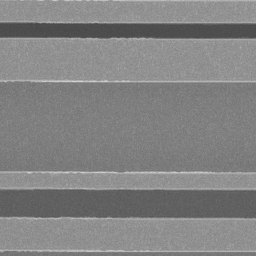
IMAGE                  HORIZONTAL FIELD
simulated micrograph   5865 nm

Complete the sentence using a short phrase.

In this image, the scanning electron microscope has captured lines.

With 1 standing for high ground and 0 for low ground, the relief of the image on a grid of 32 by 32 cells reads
11111111111111111111111111111111
11111111111111111111111111111111
11111111111111111111111111111111
00000000000000000000000000000000
00000000000000000000000000000000
11111111111111111111111111111111
11111111111111111111111111111111
11111111111111111111111111111111
11111111111111111111111111111111
11111111111111111111111111111111
00000000000000000000000000000000
00000000000000000000000000000000
00000000000000000000000000000000
00000000000000000000000000000000
00000000000000000000000000000000
00000000000000000000000000000000
00000000000000000000000000000000
00000000000000000000000000000000
00000000000000000000000000000000
00000000000000000000000000000000
00000000000000000000000000000000
00000000000000000000000000000000
11111111111111111111111111111111
00010001111111111111111111111111
00000000000000000000000000000000
00000000000000000000000000000000
00000000000000000000000000000000
11111111111111111111111111111111
11111111111111111111111111111111
11111111111111111111111111111111
11111111111111111111111111111111
00000000000000000000000000000000